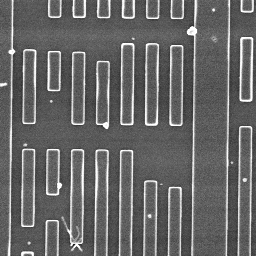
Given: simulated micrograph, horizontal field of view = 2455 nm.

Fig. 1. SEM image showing groups of lines, slits or small figures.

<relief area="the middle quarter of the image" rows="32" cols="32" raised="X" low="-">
--XXX---XXX---XXX----XX----XXX--
--XXX---XXX---XXX----XX----XXX--
--XXX---XXX---XXX----XX----XXX--
--XXX---XXX---XXX----XX----XXX--
--XXX---XXX---XXX----XX----XXX--
--XXX---XXX---XXX----XX----XXX--
--XXX---XXX---XXX----XX----XXX--
--XXX---XXX---XXX----XX----XXX--
--XXX---XXX---XXX----XX----XXX--
--XXX---XXX---XXX----XX----XXX--
--XXX---XXX---XXX----XX----XXX--
--XXX---XXX---XXX----XX----XXX--
--XXX---XXX---XXX----XX----XX---
--XXX---XXX---XXX----XX----XX---
--XXX---XXX---XXX----XX----XX---
----------X---------------------
--------------------------------
--------------------------------
--------------------------------
--------------------------------
--------------------------------
--------------------------------
--XXX---XXX---XXX---------------
--XXX---XXX---XXX---------------
--XXX---XXX---XXX---------------
--XXX---XXX---XXX---------------
--XXX---XXX---XXX---------------
--XXX---XXX---XXX---------------
--XXX---XXX---XXX---------------
--XXX---XXX---XXX---XXX---------
--XXX---XXX---XXX---XXX---------
--XXX---XXX---XXX---XXX---XXX---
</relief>